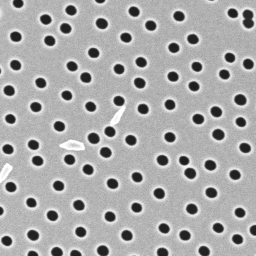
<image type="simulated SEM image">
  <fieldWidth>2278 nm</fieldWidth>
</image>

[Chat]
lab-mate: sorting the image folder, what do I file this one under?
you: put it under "a regular array of holes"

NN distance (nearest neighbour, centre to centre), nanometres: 206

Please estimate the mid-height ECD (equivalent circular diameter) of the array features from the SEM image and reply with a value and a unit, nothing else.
93.1 nanometers